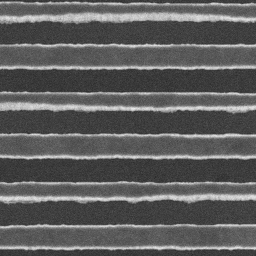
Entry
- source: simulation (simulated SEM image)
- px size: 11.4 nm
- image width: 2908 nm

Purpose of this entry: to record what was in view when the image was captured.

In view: lines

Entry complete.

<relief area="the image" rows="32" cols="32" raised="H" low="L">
HHHHHHHHHHHHHHHHHHHHHLLLLLHHLLLH
HHHHHHHHHHHHHHHHHHHHHHHHHHHHHHHH
LLLLLLLLLLLLLLLLLLLLLLLLLLLLLHHH
LLLLLLLLLLLLLLLLLLLLLLLLLLLLLLLL
LLLLLLLLLLLLLLLLLLLLLLLLLLLLLLLL
LLLLLLLLLLLLLLLLLLLLLLLLLLLLLLLL
HHHHHHHHHHHHHHHHHHHHHHHHHHHHHHHH
HHHHHHHHHHHHHHHHHHHHHHHHHHHHHHHH
HHHHHHHHHHHHHHHHHHHHHHHHHHHHHHHH
LLLLLLLLLLLLLLLLLLLLLLLLLLLLLLLL
LLLLLLLLLLLLLLLLLLLLLLLLLLLLLLLL
LLLLLLLLLLLLLLLLLLLLLLLLLLLLLLLL
HHHHHHHHHHHHHHHHHHHHHHHHHHHHHHHH
LLLLHLHHHHHHHHHHHHHHHHHHHHHHHHHH
LLLLLLLLLLLLLLLLLLLLLLLLLLLLLLLL
LLLLLLLLLLLLLLLLLLLLLLLLLLLLLLLL
LLLLLLLLLLLLLLLLLLLLLLLLLLLLLLLL
HHHHHHHHHHHHHHHHHHHHHHHHHHHHHHHH
HHHHHHHHHHHHHHHHHHHHHHHHHHHHHHHH
HHHHHHHHHHHHHHHHHHHHHHHHHHHHHHHH
LLLLLLLLLLLLLLLLLLLLLLLLLLLLLLLL
LLLLLLLLLLLLLLLLLLLLLLLLLLLLLLLL
LLLLLLLLLLLLLLLLLLLLLLLLLLLLLLLL
HHHHHHHHHHHHHHHHHHHHHHHHHHHHHHHH
HHHHHHHHHHHHHHHHHHHHHHHHHHHHHHHH
LLLLLLLLLLLLLLLLLLLLLLLLLLLLLLLL
LLLLLLLLLLLLLLLLLLLLLLLLLLLLLLLL
LLLLLLLLLLLLLLLLLLLLLLLLLLLLLLLL
HHHHHHHHHHHHHHHHHHHHHHHHHHHHHHHH
HHHHHHHHHHHHHHHHHHHHHHHHHHHHHHHH
HHHHHHHHHHHHHHHHHHHHHHHHHHHHHHHH
LLLLLLLLLLLLLLLLLLLLLLLLLLLLLLLL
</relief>